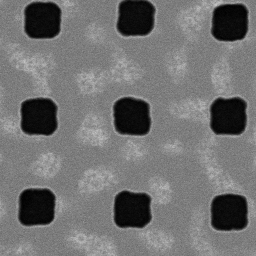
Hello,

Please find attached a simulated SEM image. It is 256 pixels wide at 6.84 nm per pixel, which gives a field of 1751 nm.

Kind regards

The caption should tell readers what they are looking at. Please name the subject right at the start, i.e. a regular array of holes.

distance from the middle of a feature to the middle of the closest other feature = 640 nm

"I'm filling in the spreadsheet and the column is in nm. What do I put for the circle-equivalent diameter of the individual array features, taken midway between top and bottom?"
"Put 264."